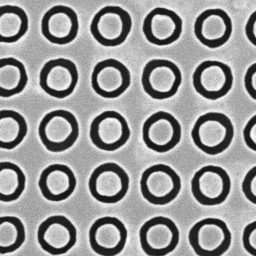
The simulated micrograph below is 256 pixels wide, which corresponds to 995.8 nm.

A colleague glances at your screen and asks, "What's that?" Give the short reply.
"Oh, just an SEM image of a regular array of ring-shaped grooves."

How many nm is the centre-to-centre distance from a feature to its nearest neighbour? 198